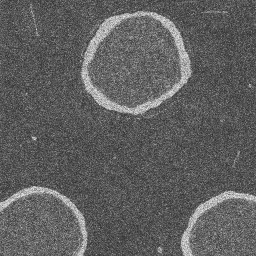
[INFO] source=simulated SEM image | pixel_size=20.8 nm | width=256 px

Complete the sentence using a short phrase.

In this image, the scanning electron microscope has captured raised bodies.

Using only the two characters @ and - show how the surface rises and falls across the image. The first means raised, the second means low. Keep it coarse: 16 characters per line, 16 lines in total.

----------------
-------@@@@-----
------@@@@@-----
------@@@@@@----
-----@@@@@@-----
------@@@@@-----
-------@@@------
----------------
----------------
----------------
----------------
----------------
-@@@----------@@
@@@@@-------@@@@
@@@@@-------@@@@
@@@@@-------@@@@